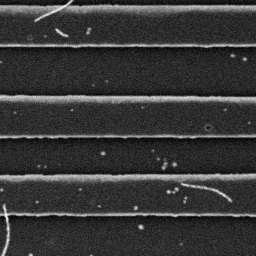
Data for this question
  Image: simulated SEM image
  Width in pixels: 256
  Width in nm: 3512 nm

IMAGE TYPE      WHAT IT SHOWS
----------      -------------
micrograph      lines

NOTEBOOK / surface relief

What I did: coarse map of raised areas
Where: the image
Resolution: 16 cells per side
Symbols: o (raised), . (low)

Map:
o..oooooo.oooooo
oooooooooooooooo
oooooooooooooooo
................
................
................
oooooooooooooooo
oooooooooooooooo
oooooooooooooooo
................
................
oooooooooooooooo
oooooooooooooooo
..........o...oo
................
................